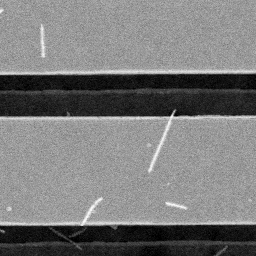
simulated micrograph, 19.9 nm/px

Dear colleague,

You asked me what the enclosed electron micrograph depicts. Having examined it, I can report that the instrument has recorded lines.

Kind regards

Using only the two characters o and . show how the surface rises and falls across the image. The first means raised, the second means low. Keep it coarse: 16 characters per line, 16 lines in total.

oooooooooooooooo
oooooooooooooooo
oooooooooooooooo
oooooooooooooooo
oooooooooooooooo
................
................
oooooooooooooooo
oooooooooooooooo
oooooooooooooooo
oooooooooooooooo
oooooooooooooooo
oooooooooooooooo
oooooooooooooooo
................
................